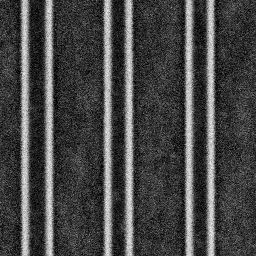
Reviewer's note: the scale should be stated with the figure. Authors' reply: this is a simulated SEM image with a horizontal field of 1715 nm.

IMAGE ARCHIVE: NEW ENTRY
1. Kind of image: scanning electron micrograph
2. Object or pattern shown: one or a few lines or trenches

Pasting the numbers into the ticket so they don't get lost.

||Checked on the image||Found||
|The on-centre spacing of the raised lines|545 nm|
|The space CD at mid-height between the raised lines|0.387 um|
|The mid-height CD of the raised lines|158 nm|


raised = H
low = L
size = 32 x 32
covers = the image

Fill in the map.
LLLHHHLLLLLLLHHHLLLLLLLLHHLLLLLL
LLLHHHLLLLLLLHHHLLLLLLLLHHLLLLLL
LLLHHHLLLLLLLHHHLLLLLLLLHHLLLLLL
LLLHHHLLLLLLLHHHLLLLLLLLHHLLLLLL
LLLHHHLLLLLLLHHHLLLLLLLLHHLLLLLL
LLLHHHLLLLLLLHHHLLLLLLLLHHLLLLLL
LLLHHHLLLLLLLHHHLLLLLLLLHHLLLLLL
LLLHHHLLLLLLLHHHLLLLLLLLHHLLLLLL
LLLHHHLLLLLLLHHHLLLLLLLLHHLLLLLL
LLLHHHLLLLLLLHHHLLLLLLLLHHLLLLLL
LLLHHHLLLLLLLHHHLLLLLLLLHHLLLLLL
LLLHHHLLLLLLLHHHLLLLLLLLHHLLLLLL
LLLHHHLLLLLLLHHHLLLLLLLLHHLLLLLL
LLLHHHLLLLLLLHHHLLLLLLLLHHLLLLLL
LLLHHHLLLLLLLHHHLLLLLLLLHHLLLLLL
LLLHHHLLLLLLLHHHLLLLLLLLHHLLLLLL
LLLHHHLLLLLLLHHHLLLLLLLLHHLLLLLL
LLLHHHLLLLLLLHHHLLLLLLLLHHLLLLLL
LLLHHHLLLLLLLHHHLLLLLLLLHHLLLLLL
LLLHHHLLLLLLLHHHLLLLLLLLHHLLLLLL
LLLHHHLLLLLLLHHHLLLLLLLLHHLLLLLL
LLLHHHLLLLLLLHHHLLLLLLLLHHLLLLLL
LLLHHHLLLLLLLHHHLLLLLLLLHHLLLLLL
LLLHHHLLLLLLLHHHLLLLLLLLHHLLLLLL
LLLHHHLLLLLLLHHHLLLLLLLLHHLLLLLL
LLLHHHLLLLLLLHHHLLLLLLLLHHLLLLLL
LLLHHHLLLLLLLHHHLLLLLLLLHHLLLLLL
LLLHHHLLLLLLLHHHLLLLLLLLHHLLLLLL
LLLHHHLLLLLLLHHHLLLLLLLLHHLLLLLL
LLLHHHLLLLLLLHHHLLLLLLLLHHLLLLLL
LLLHHHLLLLLLLHHHLLLLLLLLHHLLLLLL
LLLHHHLLLLLLLHHHLLLLLLLLHHLLLLLL